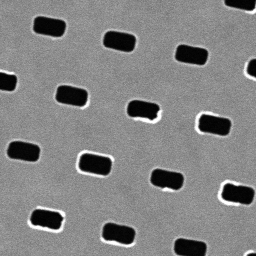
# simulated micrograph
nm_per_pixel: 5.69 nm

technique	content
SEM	a regular array of holes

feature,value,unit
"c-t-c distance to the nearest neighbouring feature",411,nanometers